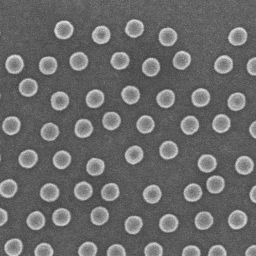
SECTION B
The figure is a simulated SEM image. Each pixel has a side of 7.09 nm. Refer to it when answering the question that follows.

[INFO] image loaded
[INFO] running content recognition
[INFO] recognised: a regular array of raised bodies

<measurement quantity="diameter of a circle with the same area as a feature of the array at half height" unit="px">17.2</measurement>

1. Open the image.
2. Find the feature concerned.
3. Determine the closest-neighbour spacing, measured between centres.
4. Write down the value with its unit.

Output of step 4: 0.214 micrometres